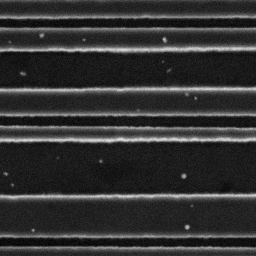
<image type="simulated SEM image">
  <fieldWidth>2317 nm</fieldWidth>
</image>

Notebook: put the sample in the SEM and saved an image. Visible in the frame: lines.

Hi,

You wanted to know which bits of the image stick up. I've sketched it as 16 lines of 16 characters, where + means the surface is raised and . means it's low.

++++++++++++++++
++++++++++++++++
++++++++++++++++
................
................
................
++++++++++++++++
++++++++++++++++
++++++++++++++++
................
................
................
++++++++++++++++
++++++++++++++++
++++++++++++++++
++++++++++++++++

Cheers